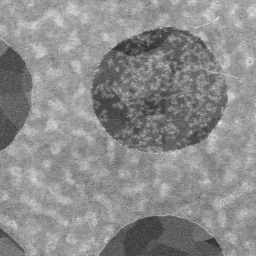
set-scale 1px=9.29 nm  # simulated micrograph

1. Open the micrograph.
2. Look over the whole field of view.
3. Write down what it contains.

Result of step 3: raised bodies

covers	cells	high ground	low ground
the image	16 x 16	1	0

0000000000000000
0000000000000000
0000000000000000
1000000000000000
1100000000000000
1100000000000000
1100000000000000
1100000000000000
1000000000000000
0000000000000000
0000000000000000
0000000000000000
0000000000000000
0000000001100000
0000000111111000
1000001111111100